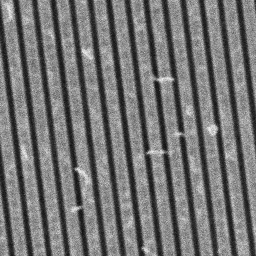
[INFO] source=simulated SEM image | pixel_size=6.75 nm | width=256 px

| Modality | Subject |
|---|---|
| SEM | parallel lines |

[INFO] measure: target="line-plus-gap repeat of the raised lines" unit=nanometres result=124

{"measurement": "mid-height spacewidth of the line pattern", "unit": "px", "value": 6.34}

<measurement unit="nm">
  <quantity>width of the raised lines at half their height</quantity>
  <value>78.7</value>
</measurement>